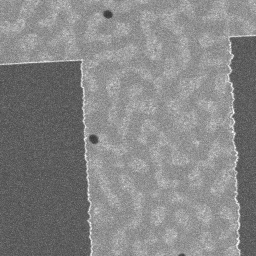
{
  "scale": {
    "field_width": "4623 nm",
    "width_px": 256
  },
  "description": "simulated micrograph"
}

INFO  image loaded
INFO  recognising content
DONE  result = one or a few lines or trenches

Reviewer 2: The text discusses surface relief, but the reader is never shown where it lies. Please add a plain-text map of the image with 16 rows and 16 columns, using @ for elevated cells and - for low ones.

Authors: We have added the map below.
----------------
----------------
---------------@
--------------@@
@@@@@---------@@
@@@@@---------@@
@@@@@----------@
@@@@@---------@@
@@@@@----------@
@@@@@----------@
@@@@@----------@
@@@@@@---------@
@@@@@@---------@
@@@@@@---------@
@@@@@@---------@
@@@@@@---------@